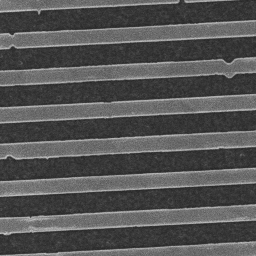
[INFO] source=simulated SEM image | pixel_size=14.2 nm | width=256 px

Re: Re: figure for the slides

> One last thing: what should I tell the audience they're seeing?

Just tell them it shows parallel lines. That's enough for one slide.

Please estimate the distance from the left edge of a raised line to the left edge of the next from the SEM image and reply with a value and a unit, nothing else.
525 nanometres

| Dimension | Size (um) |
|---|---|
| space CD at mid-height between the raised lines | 0.313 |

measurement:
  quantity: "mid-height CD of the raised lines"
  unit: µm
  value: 0.213